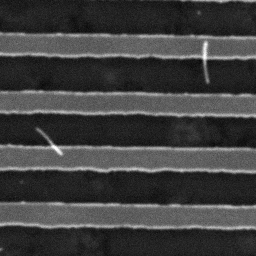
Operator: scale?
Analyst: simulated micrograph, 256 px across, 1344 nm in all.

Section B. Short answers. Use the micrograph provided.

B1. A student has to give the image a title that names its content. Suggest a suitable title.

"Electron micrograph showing lines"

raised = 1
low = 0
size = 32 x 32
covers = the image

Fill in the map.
00000000000000000000000000000000
00000000000000000000000000000000
00000000000000000000000000000000
00000000000000000000000000000000
11111111111111111111110110000000
11111111111111111111111111111111
11111111111111111111111111111111
00000000000000000000000000000000
00000000000000000000000000000000
00000000000000000000000000000000
00000000000000000000000000000000
00011100000000000000000000000000
11111111111111111111111111111111
11111111111111111111111111111111
00000000000000000000000000000001
00000000000000000000000000000000
00000000000000000000000000000000
00000000000000000000000000000000
11111111111111111111110000000000
11111111111111111111111111111111
11111111111111111111111111111111
00000000000000000000000000000011
00000000000000000000000000000000
00000000000000000000000000000000
00000000000000000000000000000000
11111111000000000000000000000000
11111111111111111111111111111111
11111111111111111111111111111111
00000000000000000000000000011100
00000000000000000000000000000000
00000000000000000000000000000000
00000000000000000000000000000000